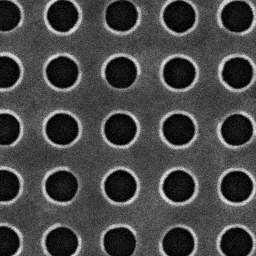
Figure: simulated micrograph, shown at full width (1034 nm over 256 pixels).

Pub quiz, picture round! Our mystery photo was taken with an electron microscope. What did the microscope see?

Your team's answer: a regular array of holes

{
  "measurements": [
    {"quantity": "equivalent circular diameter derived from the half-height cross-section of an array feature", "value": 0.132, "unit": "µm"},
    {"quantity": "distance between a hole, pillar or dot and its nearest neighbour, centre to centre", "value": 229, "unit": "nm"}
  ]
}